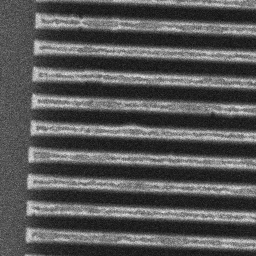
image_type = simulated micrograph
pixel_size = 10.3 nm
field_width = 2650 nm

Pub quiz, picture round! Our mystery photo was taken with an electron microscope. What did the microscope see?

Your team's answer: parallel lines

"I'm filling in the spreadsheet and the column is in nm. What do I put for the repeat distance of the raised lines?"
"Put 277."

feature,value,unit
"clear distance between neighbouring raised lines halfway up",15.1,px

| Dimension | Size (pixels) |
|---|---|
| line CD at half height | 11.7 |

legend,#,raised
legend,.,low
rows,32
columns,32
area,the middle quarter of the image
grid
................................
................................
#######################.........
################################
.........#######################
..............................##
................................
................................
######..........................
#############################...
################################
............####################
................................
................................
................................
############..#####.............
################################
################################
..................##############
................................
................................
................................
##################..............
################################
....############################
........................########
................................
................................
................................
########################........
################################
...........#####################